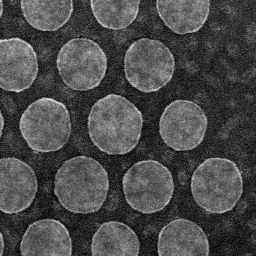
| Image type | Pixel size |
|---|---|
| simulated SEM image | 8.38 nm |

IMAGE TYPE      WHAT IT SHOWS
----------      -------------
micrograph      a regular array of raised bodies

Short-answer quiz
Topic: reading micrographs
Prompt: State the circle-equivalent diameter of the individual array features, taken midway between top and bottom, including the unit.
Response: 0.432 microns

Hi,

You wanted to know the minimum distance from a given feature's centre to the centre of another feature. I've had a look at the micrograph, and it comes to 563 nm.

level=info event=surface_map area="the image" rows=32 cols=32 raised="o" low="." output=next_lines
...oooooo..oooooo...oooooo......
...oooooo...ooooo...oooooo......
...ooooo....ooooo...oooooo......
.....oo.......o......oooo.......
................................
ooo.....oooo.....ooo............
oooo...oooooo...ooooo...........
ooooo..oooooo...oooooo..........
ooooo..oooooo...oooooo..........
ooooo...ooooo...ooooo...........
oooo....oooo....ooooo...........
..................o.............
.....o.......ooo................
...ooooo....ooooo....oooo.......
...oooooo..ooooooo..oooooo......
...oooooo..ooooooo..oooooo......
...oooooo..ooooooo..oooooo......
...ooooo....ooooo...ooooo.......
....ooo.....ooooo.....oo........
................................
ooo.....oooo.....ooo.....oooo...
oooo...oooooo...ooooo...oooooo..
oooo...oooooo..ooooooo..oooooo..
ooooo..ooooooo.ooooooo..oooooo..
oooo...oooooo...ooooo...oooooo..
oooo....ooooo...ooooo....oooo...
.o.......oo.......o........o....
.....oo...............o.........
....oooo.....ooo....ooooo.......
...oooooo...ooooo...oooooo......
...oooooo..oooooo...oooooo......
...oooooo..oooooo...oooooo......